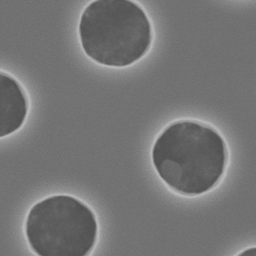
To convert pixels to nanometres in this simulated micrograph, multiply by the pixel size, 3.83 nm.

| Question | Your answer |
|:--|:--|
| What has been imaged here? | holes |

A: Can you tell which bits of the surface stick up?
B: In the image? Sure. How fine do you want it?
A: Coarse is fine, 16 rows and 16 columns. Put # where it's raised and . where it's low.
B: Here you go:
#####....#######
#####....#######
#####....#######
######...#######
################
.###############
..##############
.###############
##########....##
##########....##
##########....##
##########...###
###..###########
##....##########
##....##########
##....##########